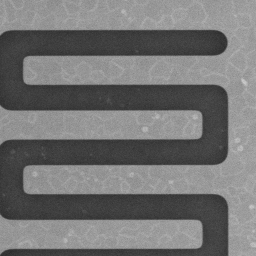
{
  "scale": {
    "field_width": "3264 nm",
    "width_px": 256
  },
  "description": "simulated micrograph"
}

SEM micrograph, groups of lines, slits or small figures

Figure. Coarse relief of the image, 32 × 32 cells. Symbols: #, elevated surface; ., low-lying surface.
################################
################################
################################
################################
............................####
............................####
............................####
...#############################
...#############################
...#############################
...#############################
............................####
.............................###
.............................###
#########################....###
#########################....###
#########################....###
#............................###
.............................###
............................####
...........................#####
...#############################
...#############################
...#############################
............................####
............................####
.............................###
##...........................###
#########################....###
#########################....###
#########################....###
.............................###